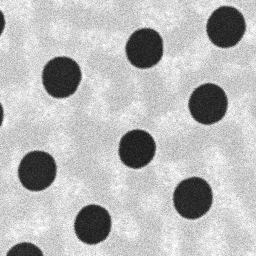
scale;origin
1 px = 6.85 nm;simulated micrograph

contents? a regular array of holes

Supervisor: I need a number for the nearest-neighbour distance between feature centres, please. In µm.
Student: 0.535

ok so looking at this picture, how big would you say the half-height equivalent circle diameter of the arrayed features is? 281 nanometres